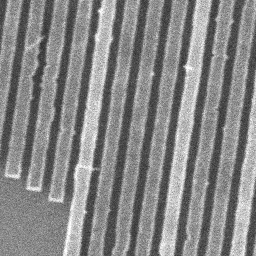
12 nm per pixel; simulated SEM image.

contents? parallel lines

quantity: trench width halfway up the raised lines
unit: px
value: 9.63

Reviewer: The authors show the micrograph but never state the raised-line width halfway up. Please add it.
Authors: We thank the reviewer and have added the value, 158 nanometers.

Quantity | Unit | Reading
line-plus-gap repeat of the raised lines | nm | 281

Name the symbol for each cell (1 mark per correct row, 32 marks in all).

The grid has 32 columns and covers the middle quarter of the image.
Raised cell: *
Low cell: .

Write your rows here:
.****..****..***...***...***..**
.****..***...***...***...***...*
.***...***...***...***...***...*
.***...***...***...***..****...*
.***...***..****...***..****..**
.***...***..****..****..****..**
****..****..***...***...***...**
***...***...***...***...***...**
***...***...***...***...***...**
***...***...***...***...***..***
***...***...***...***...***..***
***...***...***...***..****..***
***..****..****..****..***...***
***..***...***...***...***...***
***..***...***...***...***...***
**...***...***...***...***...***
***..***...***...***...***..****
**...***...***...***..****..****
**...***...***..****..****..****
**..****..****..***...***...***.
*...****..***...***...***...***.
**..***...***...***...***...***.
*...***...***...***...***...***.
*...***...***...***..****..****.
*...***...***...***..****..***..
*..****..****..****..****..***..
*..****..***...****..***...***..
...****..***...****..***...***..
...***...***...***...***...***..
...***...***...***...***..****..
...***...***...***...***..****..
...***...***...***..****..****..